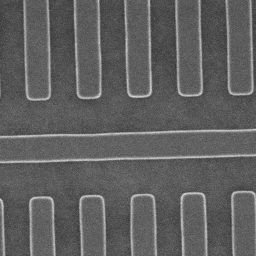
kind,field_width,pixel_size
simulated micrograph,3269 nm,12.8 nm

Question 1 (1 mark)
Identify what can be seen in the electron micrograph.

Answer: groups of lines, slits or small figures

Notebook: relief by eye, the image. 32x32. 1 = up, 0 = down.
00011100011100001110001110001110
00011100011100001110001110001110
00011100011100001110001110001110
00011100011100001110001110001110
00011100011100001110001110001110
00011100011100001110001110001110
00011100011110001110001110001111
00011100011110001110001110000111
00011100001110001110001110000111
00011100001110001110001110000111
00011100001110001110001110000111
00011100001110001110001110000110
00000000000000000000000000000000
00000000000000000000000000000000
00000000000000000000000000000000
00000000000000000000000000000000
00000000000000000001111111111111
11111111111111111111111111111111
11111111111111111111111111111111
11111111111111111111111111111000
00000000000000000000000000000000
00000000000000000000000000000000
00000000000000000000000000000000
00000000000000000000000000000000
00000000000100000110000110000111
00001110001110001110000111000111
00001110001110001110000111000111
00001110001110001110000111000111
00001110001110001110000111000111
00001110001110001110000111000111
00001110001110001110000111000111
10001110001110001111000111000111